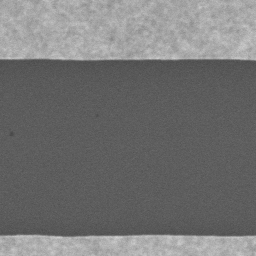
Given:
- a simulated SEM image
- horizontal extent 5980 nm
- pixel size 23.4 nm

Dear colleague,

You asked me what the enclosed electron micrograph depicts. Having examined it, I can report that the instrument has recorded wiring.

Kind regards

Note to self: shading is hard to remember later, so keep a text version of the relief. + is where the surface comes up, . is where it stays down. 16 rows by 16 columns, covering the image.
++++++++++++++++
++++++++++++++++
++++++++++++++++
++++++++++++++++
................
................
................
................
................
................
................
................
................
................
................
++++++++++++++++